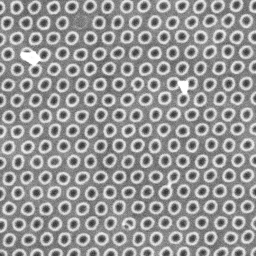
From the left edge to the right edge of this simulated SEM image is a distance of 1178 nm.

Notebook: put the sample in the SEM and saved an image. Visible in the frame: a regular array of raised bodies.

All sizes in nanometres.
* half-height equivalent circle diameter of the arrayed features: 56.8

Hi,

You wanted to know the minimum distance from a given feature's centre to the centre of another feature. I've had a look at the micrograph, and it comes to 80 nm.